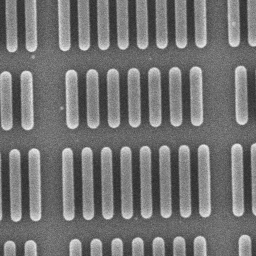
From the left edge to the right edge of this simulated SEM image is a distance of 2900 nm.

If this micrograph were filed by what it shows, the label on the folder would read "groups of lines, slits or small figures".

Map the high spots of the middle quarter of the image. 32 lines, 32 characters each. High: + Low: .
................................
............+....+....+....++...
.++...++...++...+++..+++..+++...
.++...++...++...+++..+++..+++...
.++...++...++...+++..+++...++...
.++...++...+++..+++..+++...++...
.++...++...+++..+++..+++...++...
.++...++...+++..+++..+++...++...
.++...++...+++..+++..+++...++...
.++...++...+++..+++..+++...++...
.++...++...+++..+++..+++...++...
.+++..++...+++..+++..+++...++...
.+++..+++..+++..+++...++...++...
.+++..+++..+++..+++...++...++...
.+++..+++..+++..+++...++...++...
.++...++....+....+....+.........
................................
................................
................................
................................
................................
++...++...+...+++..++...++...++.
++...++..+++..+++..+++..++...++.
++...++..+++..+++..+++..++...++.
++...++..+++..+++..+++..++...++.
++...++..+++..+++..+++..++...++.
++...++...++..+++..+++..++...++.
++...++...++..+++..+++..+++..++.
++...++...++..+++..+++..+++..++.
++...++...++..+++..+++..+++..++.
++...++...++..+++..+++..+++..++.
++...++...++..+++..+++..+++..+++